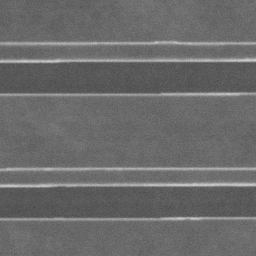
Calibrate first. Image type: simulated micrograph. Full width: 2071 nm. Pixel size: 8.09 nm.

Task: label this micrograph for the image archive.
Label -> lines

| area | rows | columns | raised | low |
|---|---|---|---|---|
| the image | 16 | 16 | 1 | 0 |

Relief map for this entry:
1111111111111111
1111111111111111
1111111111111111
1111111111111111
0000000000000000
0000000000000000
1111111111111111
1111111111111111
1111111111111111
1111111111111111
1111111111111111
1111111111111111
0000000000000000
0000000000000000
1111111111111111
1111111111111111